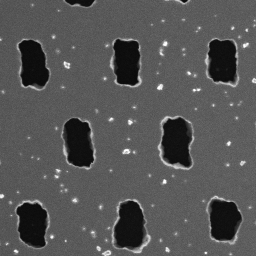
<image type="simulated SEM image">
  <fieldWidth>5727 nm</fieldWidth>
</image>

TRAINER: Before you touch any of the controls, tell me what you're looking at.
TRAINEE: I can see a regular array of holes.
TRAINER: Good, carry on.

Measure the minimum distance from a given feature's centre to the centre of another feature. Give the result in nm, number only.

2060